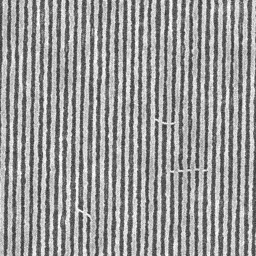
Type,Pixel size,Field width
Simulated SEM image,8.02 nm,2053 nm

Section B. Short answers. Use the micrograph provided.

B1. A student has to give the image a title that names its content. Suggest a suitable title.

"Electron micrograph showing parallel lines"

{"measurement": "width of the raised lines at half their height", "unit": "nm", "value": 34.1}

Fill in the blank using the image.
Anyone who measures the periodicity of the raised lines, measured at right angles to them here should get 66.4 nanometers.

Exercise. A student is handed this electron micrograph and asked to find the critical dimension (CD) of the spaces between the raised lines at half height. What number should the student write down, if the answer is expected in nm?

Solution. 34.1